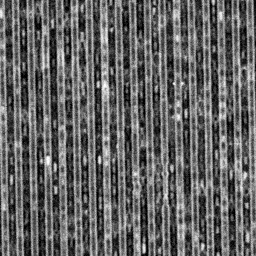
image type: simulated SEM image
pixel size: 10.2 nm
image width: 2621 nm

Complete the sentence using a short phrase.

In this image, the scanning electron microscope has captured parallel lines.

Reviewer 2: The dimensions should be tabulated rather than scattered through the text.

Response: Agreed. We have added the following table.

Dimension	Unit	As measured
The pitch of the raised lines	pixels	14.6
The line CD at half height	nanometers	67.8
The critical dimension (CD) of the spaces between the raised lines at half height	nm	88.3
